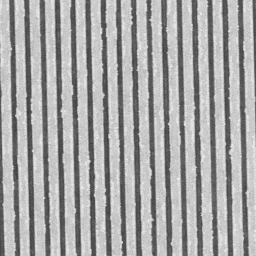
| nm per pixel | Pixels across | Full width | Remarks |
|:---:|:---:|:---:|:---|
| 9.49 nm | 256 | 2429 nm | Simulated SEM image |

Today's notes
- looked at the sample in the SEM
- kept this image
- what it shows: parallel lines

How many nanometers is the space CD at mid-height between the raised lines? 55.7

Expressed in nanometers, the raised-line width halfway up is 93.7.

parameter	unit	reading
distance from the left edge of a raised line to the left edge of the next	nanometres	144